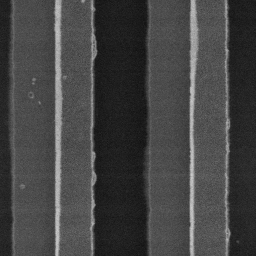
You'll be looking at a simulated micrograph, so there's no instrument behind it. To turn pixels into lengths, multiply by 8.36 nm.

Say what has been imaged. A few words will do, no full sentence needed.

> lines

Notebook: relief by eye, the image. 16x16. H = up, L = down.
LHHHHHLLLHHHHHLL
LHHHHHLLLHHHHHLL
LHHHHHLLLHHHHHLL
LHHHHHLLLHHHHHLL
LHHHHHLLLHHHHHLL
LHHHHHLLLHHHHHLL
LHHHHHLLLHHHHHLL
LHHHHHLLLHHHHHLL
LHHHHHLLLHHHHHLL
LHHHHHLLLHHHHHLL
LHHHHHLLLHHHHHLL
LHHHHHLLLHHHHHLL
LHHHHHLLLHHHHHLL
LHHHHHLLLHHHHHLL
LHHHHHLLLHHHHHLL
LHHHHHLLLHHHHHLL